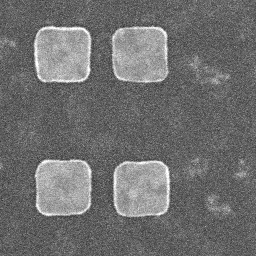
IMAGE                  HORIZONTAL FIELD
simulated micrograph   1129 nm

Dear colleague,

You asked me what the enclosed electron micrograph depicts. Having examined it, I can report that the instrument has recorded raised bodies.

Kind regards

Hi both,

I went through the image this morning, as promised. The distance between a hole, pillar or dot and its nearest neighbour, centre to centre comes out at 343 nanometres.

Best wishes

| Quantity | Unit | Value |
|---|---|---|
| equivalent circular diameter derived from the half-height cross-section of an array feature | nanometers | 263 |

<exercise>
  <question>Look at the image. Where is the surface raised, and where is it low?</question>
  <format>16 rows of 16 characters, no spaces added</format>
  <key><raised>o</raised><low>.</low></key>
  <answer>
................
................
..oooo.ooo......
..oooo.ooo......
..oooo.ooo......
................
................
................
................
................
..oooo.ooo......
..oooo.oooo.....
..oooo.oooo.....
........o.......
................
................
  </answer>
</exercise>